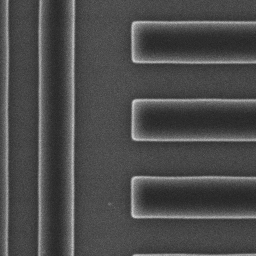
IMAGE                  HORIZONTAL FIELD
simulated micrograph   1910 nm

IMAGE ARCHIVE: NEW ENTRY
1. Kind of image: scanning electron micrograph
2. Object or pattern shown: groups of lines, slits or small figures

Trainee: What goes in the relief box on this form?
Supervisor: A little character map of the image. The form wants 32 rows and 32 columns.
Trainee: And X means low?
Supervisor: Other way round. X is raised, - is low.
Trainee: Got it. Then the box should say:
X----XXXX-----------------------
X----XXXX-----------------------
X----XXXX-----------------------
X----XXXX--------XXXXXXXXXXXXXXX
X----XXXX--------XXXXXXXXXXXXXXX
X----XXXX--------XXXXXXXXXXXXXXX
X----XXXX--------XXXXXXXXXXXXXXX
X----XXXX--------XXXXXXXXXXXXXXX
X----XXXX-----------------------
X----XXXX-----------------------
X----XXXX-----------------------
X----XXXX-----------------------
X----XXXX-----------------------
X----XXXX--------XXXXXXXXXXXXXXX
X----XXXX--------XXXXXXXXXXXXXXX
X----XXXX--------XXXXXXXXXXXXXXX
X----XXXX--------XXXXXXXXXXXXXXX
X----XXXX---------XXXXXXXXXXXXXX
X----XXXX-----------------------
X----XXXX-----------------------
X----XXXX-----------------------
X----XXXX-----------------------
X----XXXX--------XXXXXXXXXXXXXXX
X----XXXX--------XXXXXXXXXXXXXXX
X----XXXX--------XXXXXXXXXXXXXXX
X----XXXX--------XXXXXXXXXXXXXXX
X----XXXX--------XXXXXXXXXXXXXXX
X----XXXX-----------------------
X----XXXX-----------------------
X----XXXX-----------------------
X----XXXX-----------------------
X----XXXX-----------------------